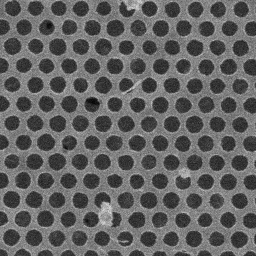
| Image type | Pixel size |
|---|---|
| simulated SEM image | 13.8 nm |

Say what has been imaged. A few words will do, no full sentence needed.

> a regular array of holes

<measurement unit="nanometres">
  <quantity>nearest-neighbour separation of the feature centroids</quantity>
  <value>304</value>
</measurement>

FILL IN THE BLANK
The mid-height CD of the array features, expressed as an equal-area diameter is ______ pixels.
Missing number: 16.7